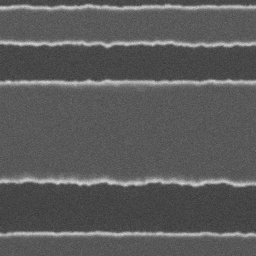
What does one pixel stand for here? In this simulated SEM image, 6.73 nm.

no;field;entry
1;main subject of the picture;lines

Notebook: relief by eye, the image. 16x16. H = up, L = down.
HHHHHHHHHHHHHHHH
HHHHHHHHHHHHHHHH
HHHHHHHHHHHHHHHH
LLLLLLLLLLLLLLLL
LLLLLLLLLLLLLLLL
HHHHHHHHHHHHHHHH
HHHHHHHHHHHHHHHH
HHHHHHHHHHHHHHHH
HHHHHHHHHHHHHHHH
HHHHHHHHHHHHHHHH
HHHHHHHHHHHHHHHH
LLLLLLLHLLLLHLHH
LLLLLLLLLLLLLLLL
LLLLLLLLLLLLLLLL
LLLLLLLLLLLLLLLL
HHHHHHHHHHHHHHHH